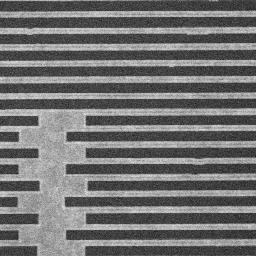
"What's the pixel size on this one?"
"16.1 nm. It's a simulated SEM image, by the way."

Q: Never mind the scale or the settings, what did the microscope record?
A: parallel lines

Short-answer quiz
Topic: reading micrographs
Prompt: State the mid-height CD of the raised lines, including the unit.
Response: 0.0703 um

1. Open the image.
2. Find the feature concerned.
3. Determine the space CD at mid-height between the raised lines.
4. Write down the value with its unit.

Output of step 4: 199 nm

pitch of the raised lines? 262 nanometers